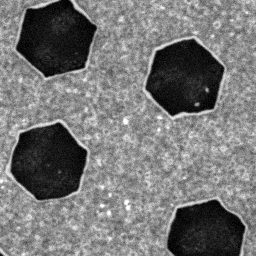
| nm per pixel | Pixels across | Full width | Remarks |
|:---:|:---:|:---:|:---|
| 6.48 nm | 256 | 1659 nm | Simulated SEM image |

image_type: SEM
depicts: holes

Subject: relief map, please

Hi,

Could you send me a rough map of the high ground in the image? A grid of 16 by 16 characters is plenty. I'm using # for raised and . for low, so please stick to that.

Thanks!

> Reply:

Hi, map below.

##...###########
#.....##########
#.....#####.####
#.....####...###
###.#####.....##
#########.....##
##########...###
################
#....###########
#....###########
#....###########
#....###########
################
###########....#
###########....#
###########....#